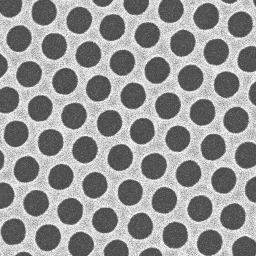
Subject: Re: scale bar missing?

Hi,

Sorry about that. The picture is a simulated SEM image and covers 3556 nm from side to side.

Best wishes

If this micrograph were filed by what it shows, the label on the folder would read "a regular array of holes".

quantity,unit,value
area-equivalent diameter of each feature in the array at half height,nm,369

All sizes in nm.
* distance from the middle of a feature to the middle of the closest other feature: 484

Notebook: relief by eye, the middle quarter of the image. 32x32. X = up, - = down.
XXXX----XXX-------XX------XXXX--
--XXXXXXXXXX-----XXX-------XX---
---XXXXXXXXXX---XXXX------XXX---
---XXXX----XXXXXXXXXX-----XX----
----XX------XXXXXXXXXX---XXX----
---XXX------XXX-----XXXXXXXXX---
---XX-------XX------XXXXXXXXXX--
--XXXX-----XXX-------XXXX---XXXX
XXXXXX-----XXX-------XX------XXX
XXXXXXXX-XXXXX------XXX------XXX
-----XXXXXXXXXX----XXXX------XXX
-----XXXXXX-XXXXXXXXXXX------XXX
------XXX-----XXXXXXXXX-----XXX-
------XX------XXXXX-XXXX---XXXXX
-----XXX-------XX-----XXXXXXXXXX
----XXXX-------XX------XXXXX--XX
XXXXXXXX------XX-------XXX-----X
XXXXXXXXX----XXX-------XXX------
XXXX---XXXXXXXXXX-----XXX-------
XXX-----XXXXXXXXX----XXXX------X
XX------XXXX----XXXXXXXXXX-----X
XX-------XX------XXXXXXXXXX---XX
XX------XXX------XXXX---XXXXXXXX
XX------XXX------XXX-----XXXXXXX
XXXX---XXXX------XX-------XXXX--
-XXXXXXXXXX------XX-------XXX---
--XXXXXXXXXX---XXXX-------XX----
--XXXX----XXXXXXXXXX-----XXX----
--XXX------XXXXXXXXXX---XXXX----
--XXX------XXXX----XXXXXXXXX----
-XXX-------XXX-----XXXXXXXXXX---
XXXXX------XX-------XXX----XXXXX